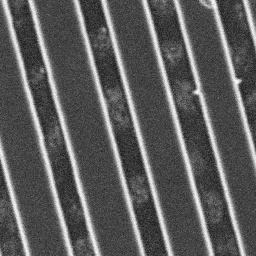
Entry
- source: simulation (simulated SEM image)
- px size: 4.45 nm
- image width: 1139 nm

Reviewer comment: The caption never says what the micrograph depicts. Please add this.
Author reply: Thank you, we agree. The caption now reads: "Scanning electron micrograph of one or a few lines or trenches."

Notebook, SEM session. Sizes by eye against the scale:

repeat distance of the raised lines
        305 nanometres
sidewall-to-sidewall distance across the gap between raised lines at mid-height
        0.112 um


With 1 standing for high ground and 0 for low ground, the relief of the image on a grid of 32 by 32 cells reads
10001111110001111100001111100001
10001111110001111110001111100001
10001111110000111110000111100001
11000111110000111110000111110001
11000111111000111110000111110000
11000111111000111111000111110000
11000111111000011111000011110000
11100011111100011111000011111000
11100011111100011111000011111000
11100011111100011111100011111000
11100011111100001111100001111100
11110001111110001111100001111100
11110001111110001111100001111100
11110001111110001111110001111100
11110000111110000111110000111110
11111000111111000111110000111110
11111000111111000111110000111110
11111000111111000111111000011110
11111000011111000011111000011111
11111100011111100011111000011111
11111100011111100011111100011111
01111100011111100001111100001111
01111110001111100001111100001111
01111110001111110001111100001111
01111110001111110001111110001111
00111110001111110000111110000111
00111111000111111000111110000111
00111111000111111000111110000111
00011111000111111000111111000111
00011111000111111000011111000011
00011111100011111100011111000011
00011111100011111100011111000011